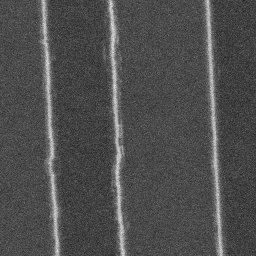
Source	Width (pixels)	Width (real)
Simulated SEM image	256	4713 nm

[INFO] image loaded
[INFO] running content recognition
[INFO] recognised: one or a few lines or trenches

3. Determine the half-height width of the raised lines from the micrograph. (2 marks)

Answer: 1800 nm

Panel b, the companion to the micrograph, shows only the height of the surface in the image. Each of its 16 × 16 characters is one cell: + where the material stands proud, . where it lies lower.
+++....++++++...
+++....++++++...
+++....++++++...
+++....++++++...
+++....++++++...
+++....++++++...
+++....++++++...
+++....++++++...
+++....++++++...
+++....++++++...
+++....++++++...
+++....+++++++..
+++....+++++++..
+++....+++++++..
+++.....++++++..
++++....++++++..